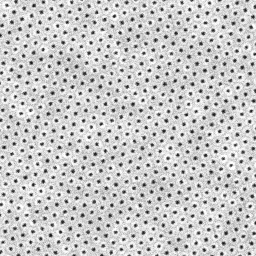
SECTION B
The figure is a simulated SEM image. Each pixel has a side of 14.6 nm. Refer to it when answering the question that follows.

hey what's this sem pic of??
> a regular array of holes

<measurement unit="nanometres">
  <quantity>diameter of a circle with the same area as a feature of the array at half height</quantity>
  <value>69.8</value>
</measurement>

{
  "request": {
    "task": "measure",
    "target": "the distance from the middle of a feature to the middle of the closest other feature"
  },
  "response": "9.98 pixels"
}